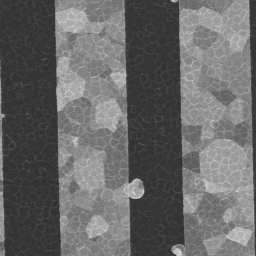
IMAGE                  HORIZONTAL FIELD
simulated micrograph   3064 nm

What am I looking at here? one or a few lines or trenches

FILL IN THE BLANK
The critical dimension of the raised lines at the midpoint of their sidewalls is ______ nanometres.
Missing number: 833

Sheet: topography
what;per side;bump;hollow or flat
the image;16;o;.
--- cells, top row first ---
....oooo...ooooo
...ooooo...ooooo
....oooo...ooooo
....oooo...ooooo
....oooo...ooooo
....oooo...ooooo
....oooo...ooooo
....oooo...ooooo
....oooo...ooooo
....oooo...ooooo
....oooo...ooooo
....ooooo..ooooo
....oooo...ooooo
....oooo...ooooo
....oooo....oooo
....oooo...ooooo